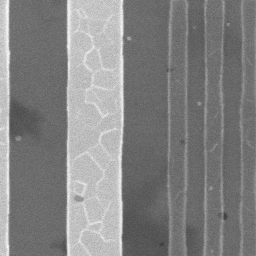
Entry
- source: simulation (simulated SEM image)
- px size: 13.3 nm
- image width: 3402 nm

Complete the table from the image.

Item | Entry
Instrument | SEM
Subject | wiring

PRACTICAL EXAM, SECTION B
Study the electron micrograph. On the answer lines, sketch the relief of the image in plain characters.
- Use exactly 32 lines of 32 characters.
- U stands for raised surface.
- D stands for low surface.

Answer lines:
UDDDDDDDDUUUUUUDDDDDDDUDDDUUDDUU
UDDDDDDDDUUUUUUDDDDDDUUDDDUUDDUU
UDDDDDDDDUUUUUUDDDDDDUUDDDUUDDUU
UDDDDDDDDUUUUUUDDDDDDUUDDDUUDDDU
UDDDDDDDDUUUUUUDDDDDDUUDDDUUDDDU
UDDDDDDDDUUUUUUDDDDDDUUDDDUUDDDU
UDDDDDDDDUUUUUUDDDDDDUUDDDUUDDDU
UDDDDDDDDUUUUUUDDDDDDUUDDDUUDDDU
UDDDDDDDDUUUUUUDDDDDDUUDDDUUDDDU
UDDDDDDDDUUUUUUDDDDDDUUDDDUUDDDU
UDDDDDDDDUUUUUUDDDDDDUUDDDUUDDDU
UDDDDDDDUUUUUUUDDDDDDUUDDDUUDDDU
UDDDDDDDUUUUUUUDDDDDDUUDDDUUDDUU
UDDDDDDDUUUUUUUDDDDDDUUDDDUUDDUU
UDDDDDDDDUUUUUUDDDDDDUUDDDUUDDUU
UDDDDDDDDUUUUUUDDDDDDUUDDDUUDDUU
UDDDDDDDDUUUUUUDDDDDDUUDDDUUDDUU
UDDDDDDDUUUUUUUDDDDDDUUDDDUUDDUU
UDDDDDDDUUUUUUUDDDDDDUUDDDUUDDUU
UDDDDDDDUUUUUUUDDDDDDUUDDDUUDDUU
UDDDDDDDUUUUUUUDDDDDDUUDDDUUDDUU
UDDDDDDDDUUUUUUDDDDDDUUDDDUUDDUU
UDDDDDDDDUUUUUUDDDDDDUUDDDUUDDUU
UDDDDDDDDUUUUUUDDDDDDUUDDDUUDDUU
UDDDDDDDDUUUUUUDDDDDDUUDDDUUDDUU
UDDDDDDDUUUUUUUDDDDDDUUDDDUUDDUU
UDDDDDDDUUUUUUUDDDDDDDUDDDUUDDUU
UDDDDDDDUUUUUUUDDDDDDDUDDDUUDDUU
UDDDDDDDUUUUUUUDDDDDDDUDDDUUDDUU
UDDDDDDDUUUUUUUDDDDDDDUDDDUUDDUU
UDDDDDDDUUUUUUUDDDDDDUUDDDUUDDUU
UDDDDDDDDUUUUUUDDDDDDUUDDDUUDDUU